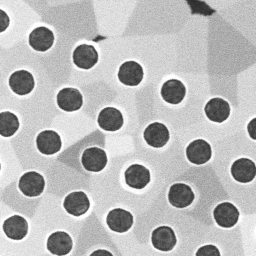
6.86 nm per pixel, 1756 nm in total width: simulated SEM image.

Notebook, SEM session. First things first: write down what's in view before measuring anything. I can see a regular array of holes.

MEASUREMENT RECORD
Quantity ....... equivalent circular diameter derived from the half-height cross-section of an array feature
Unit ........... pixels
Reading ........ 26.4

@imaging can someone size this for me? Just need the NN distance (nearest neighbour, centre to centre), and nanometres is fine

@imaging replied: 312